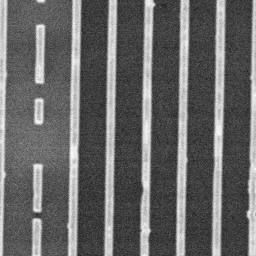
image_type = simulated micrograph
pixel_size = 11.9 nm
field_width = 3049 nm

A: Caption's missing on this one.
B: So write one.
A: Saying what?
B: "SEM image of parallel lines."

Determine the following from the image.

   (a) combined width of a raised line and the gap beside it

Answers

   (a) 429 nm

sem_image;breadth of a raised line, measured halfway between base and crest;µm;0.0849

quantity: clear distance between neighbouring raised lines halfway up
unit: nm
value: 340